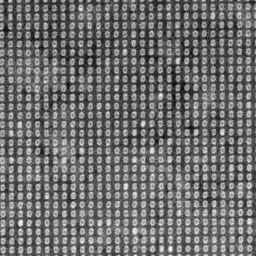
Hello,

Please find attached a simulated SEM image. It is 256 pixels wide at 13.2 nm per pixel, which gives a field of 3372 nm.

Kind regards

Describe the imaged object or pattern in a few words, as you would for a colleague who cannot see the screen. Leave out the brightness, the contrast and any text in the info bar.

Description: a regular array of raised bodies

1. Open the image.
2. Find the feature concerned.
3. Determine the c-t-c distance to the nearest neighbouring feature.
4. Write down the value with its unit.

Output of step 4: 113 nm